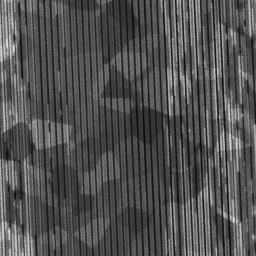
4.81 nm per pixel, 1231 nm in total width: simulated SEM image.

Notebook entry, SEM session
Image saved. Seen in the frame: parallel lines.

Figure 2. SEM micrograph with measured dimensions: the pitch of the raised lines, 30 nm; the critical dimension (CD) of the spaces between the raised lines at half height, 8.4 nm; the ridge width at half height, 21.6 nanometers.